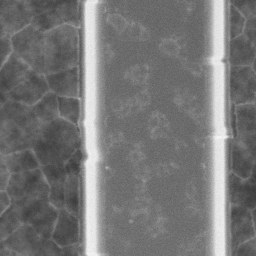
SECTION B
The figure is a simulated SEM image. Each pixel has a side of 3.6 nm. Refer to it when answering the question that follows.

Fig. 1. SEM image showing one or a few lines or trenches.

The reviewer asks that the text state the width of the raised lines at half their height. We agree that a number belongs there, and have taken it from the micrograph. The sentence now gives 0.465 µm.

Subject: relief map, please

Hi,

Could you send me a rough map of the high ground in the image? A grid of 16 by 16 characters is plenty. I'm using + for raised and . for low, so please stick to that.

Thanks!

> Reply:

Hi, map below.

......++++++++..
......++++++++..
......++++++++..
......++++++++..
......++++++++..
......++++++++..
......++++++++..
......++++++++..
......++++++++..
......++++++++..
......++++++++..
......++++++++..
......++++++++..
......++++++++..
......++++++++..
......++++++++..